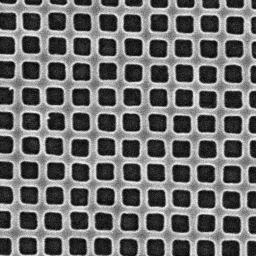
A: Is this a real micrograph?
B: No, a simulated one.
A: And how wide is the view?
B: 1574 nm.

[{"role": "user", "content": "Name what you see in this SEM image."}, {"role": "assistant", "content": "a regular array of holes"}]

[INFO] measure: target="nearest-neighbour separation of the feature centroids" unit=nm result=149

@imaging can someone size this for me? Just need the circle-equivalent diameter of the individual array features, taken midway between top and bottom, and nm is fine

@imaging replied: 124